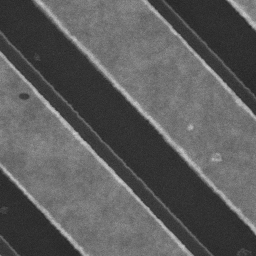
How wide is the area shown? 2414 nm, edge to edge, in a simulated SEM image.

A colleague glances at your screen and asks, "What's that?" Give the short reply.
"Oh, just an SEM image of lines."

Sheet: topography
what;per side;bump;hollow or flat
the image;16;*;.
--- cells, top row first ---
...*******.....*
....*******.....
.....*******....
.....*******....
*.....*******...
**.....*******..
***.....*******.
****.....*******
*****.....******
******.....*****
*******.....****
.*******.....***
..*******.....**
...*******.....*
....*******.....
.....*******....